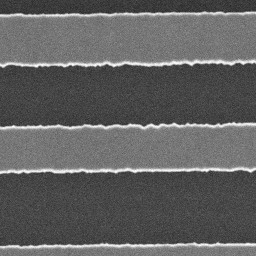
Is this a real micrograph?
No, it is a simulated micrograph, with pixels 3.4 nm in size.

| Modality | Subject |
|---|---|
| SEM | lines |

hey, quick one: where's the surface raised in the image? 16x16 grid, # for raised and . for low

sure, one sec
................
################
################
################
................
................
................
................
################
################
################
................
................
................
................
################